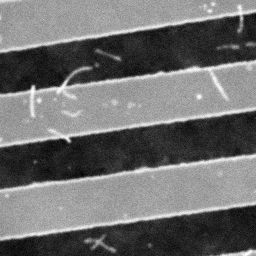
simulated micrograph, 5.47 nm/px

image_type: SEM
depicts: lines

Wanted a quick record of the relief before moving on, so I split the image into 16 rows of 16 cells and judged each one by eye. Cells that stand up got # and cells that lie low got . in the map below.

################
###########.....
#####...........
................
...........#####
...#############
################
############....
#####...........
................
..........######
..##############
################
###########.....
####............
................